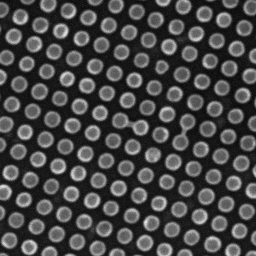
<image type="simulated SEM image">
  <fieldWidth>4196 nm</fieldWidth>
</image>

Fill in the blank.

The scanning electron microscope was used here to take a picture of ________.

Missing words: a regular array of raised bodies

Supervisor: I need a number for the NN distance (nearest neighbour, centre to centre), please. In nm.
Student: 343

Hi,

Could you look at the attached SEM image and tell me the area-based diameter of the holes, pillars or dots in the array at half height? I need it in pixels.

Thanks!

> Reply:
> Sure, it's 14.1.